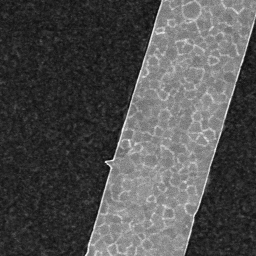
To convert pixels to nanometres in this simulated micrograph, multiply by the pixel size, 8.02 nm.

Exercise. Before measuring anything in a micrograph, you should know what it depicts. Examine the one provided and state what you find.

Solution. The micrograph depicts one or a few lines or trenches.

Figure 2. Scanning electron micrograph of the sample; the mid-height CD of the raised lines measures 759 nanometres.